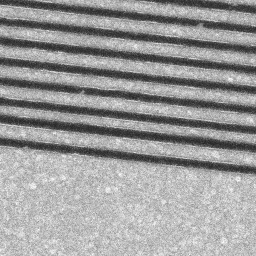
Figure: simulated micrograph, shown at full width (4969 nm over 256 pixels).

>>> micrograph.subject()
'parallel lines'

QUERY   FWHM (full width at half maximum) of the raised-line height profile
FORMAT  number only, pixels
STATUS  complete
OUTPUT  9.44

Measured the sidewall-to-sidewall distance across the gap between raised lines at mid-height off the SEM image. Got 205 nanometers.